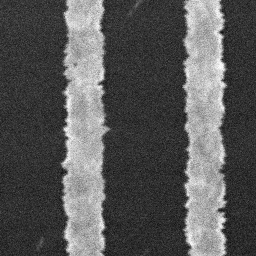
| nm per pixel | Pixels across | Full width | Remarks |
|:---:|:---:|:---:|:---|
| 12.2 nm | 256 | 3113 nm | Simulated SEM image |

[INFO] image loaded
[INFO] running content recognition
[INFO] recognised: one or a few lines or trenches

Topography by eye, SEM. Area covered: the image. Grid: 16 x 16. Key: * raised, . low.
....**......**..
....**......**..
....**......**..
....**......**..
....**......**..
....**......**..
....**......**..
....**......**..
....**......**..
....**......**..
....**......**..
....**......**..
....**......**..
....**......**..
....**......**..
....**......**..